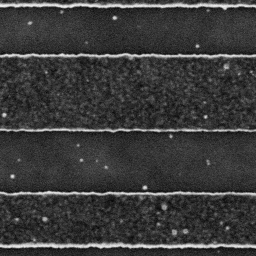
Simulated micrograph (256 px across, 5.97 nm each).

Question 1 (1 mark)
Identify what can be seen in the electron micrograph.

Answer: lines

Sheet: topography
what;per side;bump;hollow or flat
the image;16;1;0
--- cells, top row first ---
0000000000000000
0000000000000000
0000000000000000
1111111111111111
1111111111111111
1111111111111111
1111111111111111
1111111111111111
0000000000000000
0000000000000000
0000000000000000
0000000000000000
1111111111111111
1111111111111111
1111111111111111
0000000000000000